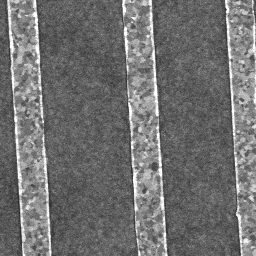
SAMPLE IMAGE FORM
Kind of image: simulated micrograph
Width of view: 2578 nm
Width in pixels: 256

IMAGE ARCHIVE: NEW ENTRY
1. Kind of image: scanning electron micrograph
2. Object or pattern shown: one or a few lines or trenches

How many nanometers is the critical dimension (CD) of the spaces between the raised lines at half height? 748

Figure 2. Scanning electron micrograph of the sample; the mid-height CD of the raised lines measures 285 nm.